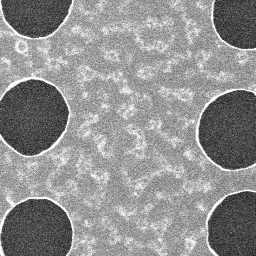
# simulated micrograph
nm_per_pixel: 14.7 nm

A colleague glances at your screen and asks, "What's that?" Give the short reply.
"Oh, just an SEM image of holes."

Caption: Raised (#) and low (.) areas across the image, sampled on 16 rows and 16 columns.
....#########...
#...#########...
##############..
################
################
#..#############
....#########...
....########....
....########....
#..##########...
##############.#
################
##.###########..
....#########...
.....########...
....#########...